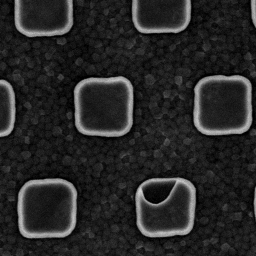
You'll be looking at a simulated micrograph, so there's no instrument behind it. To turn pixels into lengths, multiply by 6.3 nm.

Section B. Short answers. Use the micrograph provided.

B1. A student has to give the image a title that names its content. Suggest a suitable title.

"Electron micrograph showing raised bodies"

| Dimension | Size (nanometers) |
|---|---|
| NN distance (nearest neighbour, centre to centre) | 737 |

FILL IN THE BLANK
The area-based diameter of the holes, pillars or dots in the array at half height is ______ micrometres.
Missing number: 0.384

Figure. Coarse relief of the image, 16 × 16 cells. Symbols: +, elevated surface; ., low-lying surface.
.+++....++++....
.+++.....+++....
................
................
................
+....+++....++++
+....+++....++++
+....+++....++++
................
................
................
..++.....+++....
.++++....+++....
.++++....+++....
..++.....+++....
................